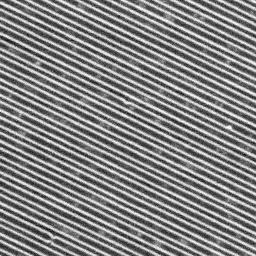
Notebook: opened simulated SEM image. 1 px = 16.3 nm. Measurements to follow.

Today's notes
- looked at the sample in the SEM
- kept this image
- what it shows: parallel lines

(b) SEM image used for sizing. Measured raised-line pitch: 226 nm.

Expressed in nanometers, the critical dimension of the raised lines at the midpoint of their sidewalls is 132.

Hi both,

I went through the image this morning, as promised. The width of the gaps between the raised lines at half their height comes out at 6.19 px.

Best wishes